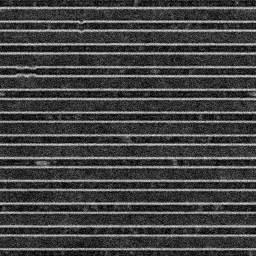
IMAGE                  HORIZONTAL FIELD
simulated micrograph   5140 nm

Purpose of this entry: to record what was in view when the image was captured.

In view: parallel lines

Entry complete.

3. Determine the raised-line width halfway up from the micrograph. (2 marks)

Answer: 0.191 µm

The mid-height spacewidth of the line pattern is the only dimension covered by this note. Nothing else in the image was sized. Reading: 268 nm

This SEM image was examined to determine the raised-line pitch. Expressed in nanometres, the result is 457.